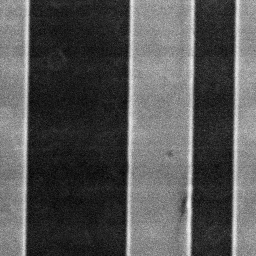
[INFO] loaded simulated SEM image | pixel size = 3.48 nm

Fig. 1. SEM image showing one or a few lines or trenches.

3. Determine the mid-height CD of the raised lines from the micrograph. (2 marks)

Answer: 0.217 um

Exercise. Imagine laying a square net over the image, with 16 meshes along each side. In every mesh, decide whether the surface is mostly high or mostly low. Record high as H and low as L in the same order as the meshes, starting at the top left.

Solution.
HHLLLLLLHHHHLLLH
HHLLLLLLHHHHLLLH
HHLLLLLLHHHHLLLH
HHLLLLLLHHHHLLLH
HHLLLLLLHHHHLLLH
HHLLLLLLHHHHLLLH
HHLLLLLLHHHHLLLH
HHLLLLLLHHHHLLLH
HHLLLLLLHHHHLLLH
HHLLLLLLHHHHLLLH
HHLLLLLLHHHHLLLH
HHLLLLLLHHHLLLLH
HHLLLLLLHHHLLLLH
HHLLLLLLHHHLLLLH
HHLLLLLLHHHLLLLH
HHLLLLLLHHLLLLLH